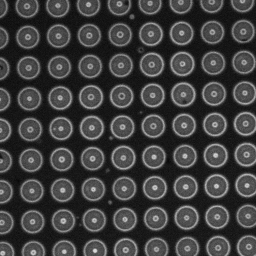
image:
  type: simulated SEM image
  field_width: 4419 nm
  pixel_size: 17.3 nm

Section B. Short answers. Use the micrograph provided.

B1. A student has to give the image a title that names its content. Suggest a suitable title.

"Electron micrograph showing an array of small figures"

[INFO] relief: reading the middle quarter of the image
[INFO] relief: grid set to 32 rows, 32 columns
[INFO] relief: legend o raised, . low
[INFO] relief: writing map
.ooo..o..ooo..o..oo......oo.....
.ooo.....ooo.....ooo....ooo.....
.oooo...ooooo...ooooo..oooooo..o
oooooooooooooooooooooooooooooooo
oooooooooooooooooooooooooooooooo
oooooooooooooo.oooooo..ooooo....
.oooo....ooo.....ooo....ooo.....
.ooo.....ooo..o..oo......oo..o..
..oo..o..ooo..o..ooo.....oo.....
.ooo.....ooo....oooo....oooo....
.oooo...ooooo..ooooooo.ooooooooo
oooooooooooooooooooooooooooooooo
oooooooooooooooooooooooooooooooo
oooooo..ooooo...ooooo...oooo....
.oooo....ooo.....ooo.....ooo....
..oo......oo..o..ooo..o..oo.....
..oo......oo.....ooo.....ooo....
.oooo....oooo....oooo...ooooo...
oooooo..oooooooooooooooooooooooo
oooooooooooooooooooooooooooooooo
oooooooooooooooooooooooooooooo.o
oooooo...oooo....oooo...oooo....
..ooo....ooo.....ooo.....ooo....
..oo......oo..o..ooo.....ooo....
..ooo....ooo.....ooo.....ooo....
.oooo....oooo....oooo...ooooo..o
oooooooooooooooooooooooooooooooo
oooooooooooooooooooooooooooooooo
oooooooooooooooooooooo..ooooo...
.oooo....oooo....ooo.....ooo....
..ooo.....ooo.....oo.....ooo....
..ooo.....oo......oo.....ooo....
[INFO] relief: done